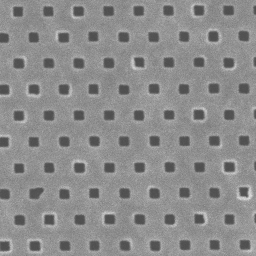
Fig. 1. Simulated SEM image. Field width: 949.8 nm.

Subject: a regular array of holes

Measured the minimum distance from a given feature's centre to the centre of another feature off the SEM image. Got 110 nm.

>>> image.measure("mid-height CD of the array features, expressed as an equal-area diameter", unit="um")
0.044